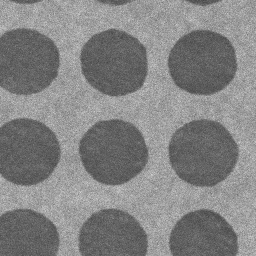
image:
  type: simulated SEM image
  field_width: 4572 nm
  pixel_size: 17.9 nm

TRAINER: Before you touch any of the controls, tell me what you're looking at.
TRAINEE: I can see holes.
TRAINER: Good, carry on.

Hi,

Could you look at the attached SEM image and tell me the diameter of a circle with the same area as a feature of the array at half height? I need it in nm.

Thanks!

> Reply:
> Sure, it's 1210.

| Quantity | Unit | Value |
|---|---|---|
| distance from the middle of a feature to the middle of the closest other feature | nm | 1580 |